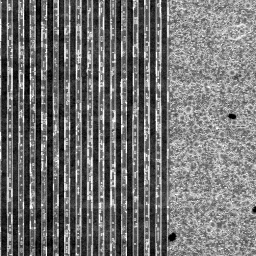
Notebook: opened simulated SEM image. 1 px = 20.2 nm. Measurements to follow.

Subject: parallel lines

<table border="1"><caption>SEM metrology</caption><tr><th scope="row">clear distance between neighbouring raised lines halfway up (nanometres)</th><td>119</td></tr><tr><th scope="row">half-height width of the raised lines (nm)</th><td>98.7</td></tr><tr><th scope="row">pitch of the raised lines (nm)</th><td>232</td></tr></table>